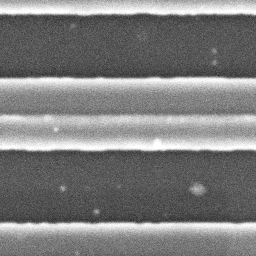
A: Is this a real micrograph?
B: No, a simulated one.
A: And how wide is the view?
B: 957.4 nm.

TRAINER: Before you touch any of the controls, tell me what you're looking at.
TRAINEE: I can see lines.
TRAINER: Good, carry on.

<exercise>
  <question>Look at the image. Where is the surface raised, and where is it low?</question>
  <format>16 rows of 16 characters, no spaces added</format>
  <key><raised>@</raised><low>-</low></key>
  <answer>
@@@@@@@@@@@@@@@@
----------------
----------------
----------------
----------------
@@@@@@@@@@@@@@@@
@@@@@@@@@@@@@@@@
@@@@@@@@@@@@@@@@
@@@@@@@@@@@@@@@@
----------------
----------------
----------------
----------------
----------------
@@@@@@@@@@@@@@@@
@@@@@@@@@@@@@@@@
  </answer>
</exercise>